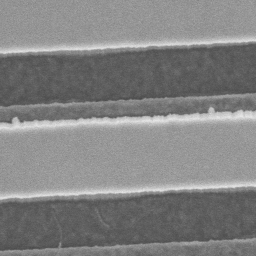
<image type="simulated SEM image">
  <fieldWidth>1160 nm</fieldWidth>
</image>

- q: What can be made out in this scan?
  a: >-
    lines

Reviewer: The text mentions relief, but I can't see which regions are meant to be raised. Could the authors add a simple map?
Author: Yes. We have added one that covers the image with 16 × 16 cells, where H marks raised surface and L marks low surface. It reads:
HHHHHHHHHHHHHHHH
HHHHHHHHHHHHHHHH
HHHHHHHHHHHHHHHH
LLLLLLLLLLLLLLLL
LLLLLLLLLLLLLLLL
LLLLLLLLLLLLLLLL
LLLLLLHHHHHLLLLL
HHHHHHHHHHHHHHHH
HHHHHHHHHHHHHHHH
HHHHHHHHHHHHHHHH
HHHHHHHHHHHHHHHH
HHHHHHHHHHHHHHHH
LLLLLLLLLLLLLLLL
LLLLLLLLLLLLLLLL
LLLLLLLLLLLLLLLL
LLLLHHLLLHHLLHHL